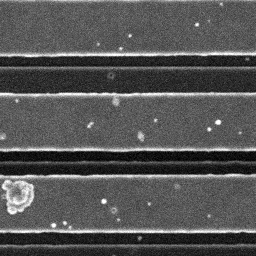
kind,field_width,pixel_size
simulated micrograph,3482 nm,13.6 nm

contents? lines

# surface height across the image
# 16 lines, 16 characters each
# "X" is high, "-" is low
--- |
XXXXXXXXXXXXXXXX
XXXXXXXXXXXXXXXX
XXXXXXXXXXXXXXXX
-XX-------------
----------------
----------------
XXXXXXXXXXXXXXXX
XXXXXXXXXXXXXXXX
XXXXXXXXXXXXXXXX
----------------
----------------
XXXXXXXXXXXXXXXX
XXXXXXXXXXXXXXXX
XXXXXXXXXXXXXXXX
XXXXXXXXXXXXXXXX
----------------